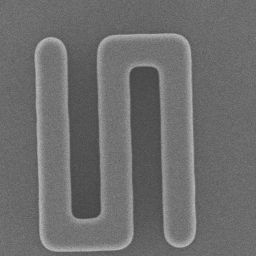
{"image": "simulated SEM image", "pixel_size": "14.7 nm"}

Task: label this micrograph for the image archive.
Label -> groups of lines, slits or small figures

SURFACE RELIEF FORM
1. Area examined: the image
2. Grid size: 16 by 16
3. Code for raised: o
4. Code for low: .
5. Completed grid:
................
................
...o...ooooo....
..oo..oooooo....
..oo..oo..oo....
..oo..oo..oo....
..oo..oo..oo....
..oo..oo..oo....
..oo..oo..oo....
..oo..oo..oo....
..oo..oo..oo....
..oo..oo..oo....
..oo..oo..oo....
..ooo.oo..oo....
...ooooo..oo....
...ooooo........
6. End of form